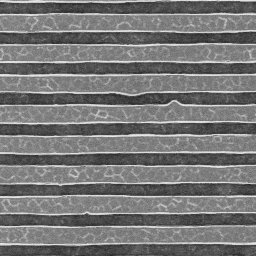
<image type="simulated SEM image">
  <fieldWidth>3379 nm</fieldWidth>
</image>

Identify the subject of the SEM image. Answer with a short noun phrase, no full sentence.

parallel lines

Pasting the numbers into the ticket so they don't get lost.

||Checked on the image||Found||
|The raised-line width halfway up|17.7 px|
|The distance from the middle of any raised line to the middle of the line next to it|400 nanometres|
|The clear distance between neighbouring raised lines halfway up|167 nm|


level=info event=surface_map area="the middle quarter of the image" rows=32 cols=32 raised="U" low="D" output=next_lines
DDDDDDDDDDDDDDDDDDDDDDDDDDDDDDDD
DDDDDDDDDDDDDDDDDDDDDDDDDDDDDDDD
DDDDDDDDDDDDDDDDDDDDDDDDDDDDDDDD
UUUUUUUUUUUUUUUUUUUUUUUUUUUUUUUU
UUUUUUUUUUUUUUUUUUUUUUUUUUUUUUUU
UUUUUUUUUUUUUUUUUUUUUUUUUUUUUUUU
UUUUUUUUUUUUUUUUUUUUUUUUUUUUUUUU
DDDDDDDDDDDDDDDUUUUDDDDDDDDDDDDD
DDDDDDDDDDDDDDDDDDDDDDDDDDDDDDDD
DDDDDDDDDDDDDDDDDDDDDDDDDDDUDDDD
UUUUUUUUUDDDDDDDDUUUUUUUUUUUUUUU
UUUUUUUUUUUUUUUUUUUUUUUUUUUUUUUU
UUUUUUUUUUUUUUUUUUUUUUUUUUUUUUUU
UUUUUUUUUUUUUUUUUUUUUUUUUUUUUUUU
UUUUUUUUDDDDDDDUUUUUDDDDUDDDDDDD
DDDDDDDDDDDDDDDDDDDDDDDDDDDDDDDD
DDDDDDDDDDDDDDDDDDDDDDDDDDDDDDDD
DDDDDDDDDDDDDDDDDDDDDDDDDDDDDDDD
UUUUUUUUUUUUUUUUUUUUUUUUUUUUUUUU
UUUUUUUUUUUUUUUUUUUUUUUUUUUUUUUU
UUUUUUUUUUUUUUUUUUUUUUUUUUUUUUUU
UUUUUUUUUUUUUUUUUUUUUUUUUUUUUUUU
DDDDDDDDDDDDDDDDDDDDDDDDDDDDDDDD
DDDDDDDDDDDDDDDDDDDDDDDDDDDDDDDD
DDDDDDDDDDDDDDDDDDDDDDDDDDDDDDDD
DDDUUUUUUUUUUUUUUUUUDDDDDDDDUUUU
UUUUUUUUUUUUUUUUUUUUUUUUUUUUUUUU
UUUUUUUUUUUUUUUUUUUUUUUUUUUUUUUU
UUUUUUUUUUUUUUUUUUUUUUUUUUUUUUUU
UUUUUUUUUUUUUUUUUUUUUUUUUUUUUUUU
DDDDDDDDDDDDDDDDDDDDDDDDDDDDDDDD
DDDDDDDDDDDDDDDDDDDDDDDDDDDDDDDD